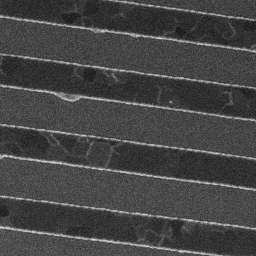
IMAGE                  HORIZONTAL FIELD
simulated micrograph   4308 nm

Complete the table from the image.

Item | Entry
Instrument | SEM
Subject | lines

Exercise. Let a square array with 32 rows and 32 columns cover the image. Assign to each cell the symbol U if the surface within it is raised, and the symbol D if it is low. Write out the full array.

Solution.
UUUUUUUUUUUUUUUUUUDDDDDDDDDDDDDD
UUUUUUUUUUUUUUUUUUUUUUUUUDDDDDDD
DDDUUUUUUUUUUUUUUUUUUUUUUUUUUUUU
DDDDDDDDDDUUUUUUUUUUUUUUUUUUUUUU
DDDDDDDDDDDDDDDDDDUUUUUUUUUUUUUU
DDDDDDDDDDDDDDDDDDDDDDDDUUUUUUUU
DDDDDDDDDDDDDDDDDDDDDDDDDDDDDDDD
UUUUUUDDDDDDDDDDDDDDDDDDDDDDDDDD
UUUUUUUUUUUUUDDDDDDDDDDDDDDDDDDD
UUUUUUUUUUUUUUUUUUUUDDDDDDDDDDDD
UUUUUUUUUUUUUUUUUUUUUUUUUUUUDDDD
DDDDDUUUUUUUUUUUUUUUUUUUUUUUUUUU
DDDDDDDDUDDDDUUUUUUUUUUUUUUUUUUU
DDDDDDDDDDDDDDDDDDDDUUUUUUUUUUUU
DDDDDDDDDDDDDDDDDDDDDDDDDDDUUUUU
DDDDDDDDDDDDDDDDDDDDDDDDDDDDDDDD
UUUUUUUUDDDDDDDDDDDDDDDDDDDDDDDD
UUUUUUUUUUUUUUUDDDDDDDDDDDDDDDDD
UUUUUUUUUUUUUUUUUUUUUUDDDDDDDDDD
UUUUUUUUUUUUUUUUUUUUUUUUUUUUUDDD
DDDDDDDDUUUUUUUUUUUUUUUUUUUUUUUU
DDDDDDDDDDDDDDDUUUUUUUUUUUUUUUUU
DDDDDDDDDDDDDDDDDDDDDDUUUUUUUUUU
DDDDDDDDDDDDDDDDDDDDDDDDDDDDDDUU
DDDDDDDDDDDDDDDDDDDDDDDDDDDDDDDD
UUUUUUUUDDDDDDDDDDDDDDDDDDDDDDDD
UUUUUUUUUUUUUUUUDDDDDDDDDDDDDDDD
UUUUUUUUUUUUUUUUUUUUUUUDDDDDDDDD
UUUUUUUUUUUUUUUUUUUUUUUUUUUUUUUU
DDDDDDDUUUUUUUUUUUUUUUUUUUUUUUUU
DDDDDDDDDDDDDDDDUUUUUUUUUUUUUUUU
DDDDDDDDDDDDDDDDDDDDDDDUUUUUUUUU